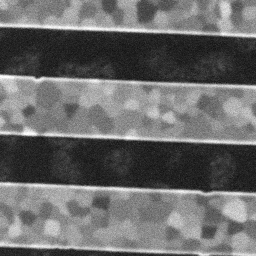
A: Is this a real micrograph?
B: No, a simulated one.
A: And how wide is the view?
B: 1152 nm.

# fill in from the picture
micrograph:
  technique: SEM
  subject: one or a few lines or trenches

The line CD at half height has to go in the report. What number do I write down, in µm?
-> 0.263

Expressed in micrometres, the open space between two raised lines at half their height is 0.223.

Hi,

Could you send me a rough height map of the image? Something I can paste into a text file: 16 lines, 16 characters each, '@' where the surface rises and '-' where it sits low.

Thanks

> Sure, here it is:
@@@@@@@@@@@@@@@@
@@@@@@@@@@@@@@@@
----------------
----------------
----------------
@@@@@@@@@@@@@@@@
@@@@@@@@@@@@@@@@
@@@@@@@@@@@@@@@@
----@@@@@@@@@@@@
----------------
----------------
@---------------
@@@@@@@@@@@@@@@@
@@@@@@@@@@@@@@@@
@@@@@@@@@@@@@@@@
---@@@@@@@@@@@@@